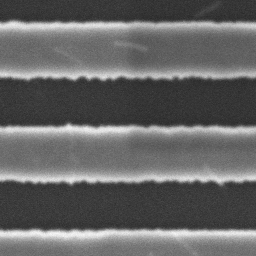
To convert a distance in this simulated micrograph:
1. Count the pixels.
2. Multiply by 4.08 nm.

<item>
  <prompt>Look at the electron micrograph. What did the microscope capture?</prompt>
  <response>lines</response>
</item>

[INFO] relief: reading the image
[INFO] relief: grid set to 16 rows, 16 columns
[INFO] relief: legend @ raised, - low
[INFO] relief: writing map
----------------
@@@@@@@@@@@@@@@@
@@@@@@@@@@@@@@@@
@@@@@@@@@@@@@@@@
@@@@@@@@@@@@@@@@
----------------
----------------
----------------
@@@@@@@@@@@@@@@@
@@@@@@@@@@@@@@@@
@@@@@@@@@@@@@@@@
----------------
----------------
----------------
@@@@@@@@@@@@@@@@
@@@@@@@@@@@@@@@@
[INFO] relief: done